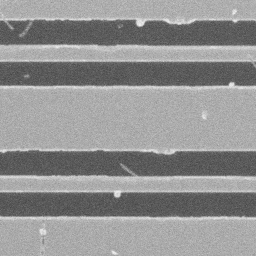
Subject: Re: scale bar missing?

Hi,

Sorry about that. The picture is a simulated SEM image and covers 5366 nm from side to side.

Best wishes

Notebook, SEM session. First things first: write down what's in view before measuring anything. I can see lines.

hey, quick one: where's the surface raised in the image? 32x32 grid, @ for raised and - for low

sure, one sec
@@@@@@@@@@@@@@@@@@@@@@@@@@@@@@@@
@@@@@@@@@@@@@@@@@@@@@@@@@@@@@@@@
@----------------@@-@@@@-----@-@
--------------------------------
--------------------------------
--------------------------------
@@@@@@@@@@@@@@@@@@@@@@@@@@@@@@@@
@@@@@@@@@@@@@@@@@@@@@@@@@@@@@@@@
--------------------------------
--------------------------------
--------------------------------
@@@@@@@@@@@@@@@@@@@@@@@@@@@@@@@@
@@@@@@@@@@@@@@@@@@@@@@@@@@@@@@@@
@@@@@@@@@@@@@@@@@@@@@@@@@@@@@@@@
@@@@@@@@@@@@@@@@@@@@@@@@@@@@@@@@
@@@@@@@@@@@@@@@@@@@@@@@@@@@@@@@@
@@@@@@@@@@@@@@@@@@@@@@@@@@@@@@@@
@@@@@@@@@@@@@@@@@@@@@@@@@@@@@@@@
@@@@@@@@@@@@@@@@@@@@@@@@@@@@@@@@
--------------------------------
--------------------------------
--------------------------------
@@@@@@@@@@@@@@@@@@@@@@@@@@@@@@@@
@@@@@@@@@@@@@@@@@@@@@@@@@@@@@@@@
--------------------------------
--------------------------------
--------------------------------
@@@@@@@@@@@@@@@@@@@@@@@@@@@@@@@@
@@@@@@@@@@@@@@@@@@@@@@@@@@@@@@@@
@@@@@@@@@@@@@@@@@@@@@@@@@@@@@@@@
@@@@@@@@@@@@@@@@@@@@@@@@@@@@@@@@
@@@@@@@@@@@@@@@@@@@@@@@@@@@@@@@@